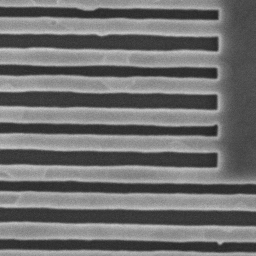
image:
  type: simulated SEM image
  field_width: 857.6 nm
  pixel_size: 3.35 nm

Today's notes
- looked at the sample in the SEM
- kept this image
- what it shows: parallel lines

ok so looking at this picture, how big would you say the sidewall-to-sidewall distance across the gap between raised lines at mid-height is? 37.3 nm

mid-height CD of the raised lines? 53.6 nanometres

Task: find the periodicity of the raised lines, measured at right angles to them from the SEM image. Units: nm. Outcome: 99.6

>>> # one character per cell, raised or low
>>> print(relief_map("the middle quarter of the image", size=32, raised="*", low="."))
.................***************
................................
................................
*************.************......
********************************
********************************
********************************
................................
................................
................................
................................
**************************.....*
********************************
********************************
********************************
.........................*.**...
................................
................................
********************************
********************************
********************************
*****...************************
................................
................................
................................
................................
********************************
********************************
********************************
...........**********.**********
................................
................................